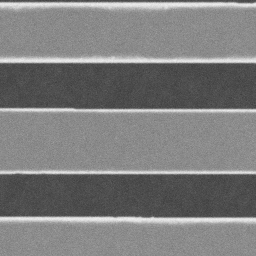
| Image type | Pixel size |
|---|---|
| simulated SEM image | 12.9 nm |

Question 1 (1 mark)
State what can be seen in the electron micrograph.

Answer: lines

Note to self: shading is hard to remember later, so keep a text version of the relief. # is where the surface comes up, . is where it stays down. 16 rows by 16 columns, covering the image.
################
################
################
################
................
................
................
################
################
################
################
................
................
................
################
################